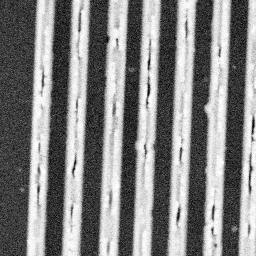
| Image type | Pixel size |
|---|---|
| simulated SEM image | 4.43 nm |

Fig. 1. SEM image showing parallel lines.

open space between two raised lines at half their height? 105 nanometers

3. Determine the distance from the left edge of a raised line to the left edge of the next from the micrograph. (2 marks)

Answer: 156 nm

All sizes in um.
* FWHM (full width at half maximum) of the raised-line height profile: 0.0504